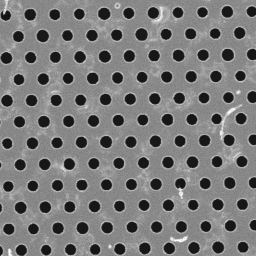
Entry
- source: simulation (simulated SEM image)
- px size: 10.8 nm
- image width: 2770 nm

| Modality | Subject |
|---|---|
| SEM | a regular array of holes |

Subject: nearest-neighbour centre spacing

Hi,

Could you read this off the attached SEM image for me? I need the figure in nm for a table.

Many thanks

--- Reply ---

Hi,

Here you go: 265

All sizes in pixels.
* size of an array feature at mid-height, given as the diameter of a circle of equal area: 11.3